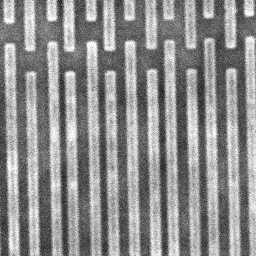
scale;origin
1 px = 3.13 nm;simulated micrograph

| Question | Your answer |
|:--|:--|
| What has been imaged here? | parallel lines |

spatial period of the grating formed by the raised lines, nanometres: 62.9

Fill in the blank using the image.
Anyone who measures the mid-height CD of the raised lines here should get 29.4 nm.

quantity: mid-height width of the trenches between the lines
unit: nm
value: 35.2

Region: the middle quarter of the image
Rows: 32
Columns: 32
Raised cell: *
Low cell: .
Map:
......**........**.......***....
......**........**....*..***....
***...**..***...**...**..***...*
***...**...**...**...**..***...*
***...**...**...**...**..***...*
.**...**...**...**...**...**...*
.**...**...**...**...**...**...*
.**...**...**...**...**...**...*
.**...**...**...**...**...**...*
.**...**...**...**...**...**...*
.**...**...**...**...**...**...*
.**...**...**...**...**...**...*
.**...**...**...**...**...**...*
.**...**...**...**...**...**...*
.**...**...**...**...**...**...*
.**...**...**...**...**...**...*
.**...**...**...**...**...**...*
.**...**...**...**...**...**...*
.**...***..**...**...**...**...*
.**...***..**...**...**...**...*
.**...***..**...**...**...**...*
.**...***..**...**...***..**...*
.**...***..**...**...***..**...*
.**....**..**...**...***..**...*
.**....**..**...**...***..**...*
.**....**..**...**....**..**...*
.**....**..**...**....**..**...*
.**....**..**...**....**..**...*
.**....**..**...**....**..**...*
.**....**..**...**....**..**...*
.**....**..**...**....**..**...*
.**....**..**...**....**..**...*